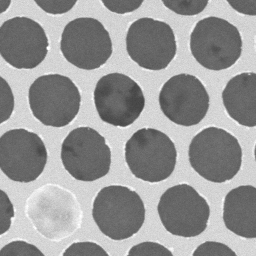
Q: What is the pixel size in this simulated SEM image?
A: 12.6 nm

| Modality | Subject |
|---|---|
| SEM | a regular array of holes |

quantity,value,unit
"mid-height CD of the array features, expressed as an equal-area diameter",661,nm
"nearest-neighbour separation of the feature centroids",810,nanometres